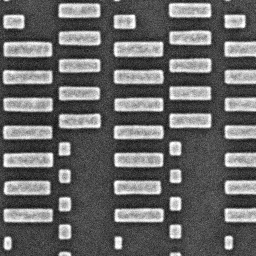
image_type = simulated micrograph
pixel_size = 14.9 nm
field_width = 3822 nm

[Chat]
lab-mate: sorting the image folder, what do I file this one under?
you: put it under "wiring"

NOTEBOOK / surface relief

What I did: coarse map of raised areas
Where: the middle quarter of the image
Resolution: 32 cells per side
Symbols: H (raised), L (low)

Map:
HHHHHHHHHLLLLLLLLLLLLLLLLLLHHHHH
HHHHHHHHHLLLLLLLLLLLLLLLLLLHHHHH
LLLLLLLLLLLLLHHHHHHHHHHHLLLLLLLL
LLLLLLLLLLLLLHHHHHHHHHHHHLLLLLLL
LLLLLLLLLLLLLHHHHHHHHHHHLLLLLLLL
LLLLLLLLLLLLLLLLLLLLLLLLLLLLLLLL
HHHHHHHHHLLLLLLLLLLLLLLLLLLHHHHH
HHHHHHHHHLLLLLLLLLLLLLLLLLLHHHHH
HHHHHHHHHLLLLLLLLLLLLLLLLLLHHHHH
LLLLLLLLLLLLLHHHHHHHHHHHLLLLLLLL
LLLLLLLLLLLLLHHHHHHHHHHHLLLLLLLL
LLLLLLLLLLLLLHHHHHHHHHHHLLLLLLLL
LLLLLLLLLLLLLLLLLLLLLLLLLLLLLLLL
HHHHHHHHHLLLLLLLLLLLLLLLLLLHHHHH
HHHHHHHHHLLLLLLLLLLLLLLLLLLHHHHH
HHHHHHHHHLLLLLLLLLLLLLLLLLLHHHHH
LLLLLLLLLLLLLHHHHHHHHHHHHLLLLLLL
LLLLLLLLLLLLLHHHHHHHHHHHHLLLLLLL
LLLLLLLLLLLLLLLLLLLLLLLLLLLLLLLL
LLLLLLLLLLLLLLLLLLLLLLLLLLLLLLLL
HLLLLLLLLLLLLLLLLLLLLLLLLLLHHLLL
HLLLLLLLLLLLLLLLLLLLLLLLLLLHHLLL
HLLLLLLLLLLLLHHHHHHHHHHHLLLHHLLL
LLLLLLLLLLLLLHHHHHHHHHHHLLLLLLLL
LLLLLLLLLLLLLHHHHHHHHHHHLLLLLLLL
LLLLLLLLLLLLLLLLLLLLLLLLLLLLLLLL
LLLLLLLLLLLLLLLLLLLLLLLLLLLLLLLL
HLLLLLLLLLLLLLLLLLLLLLLLLLLHHLLL
HLLLLLLLLLLLLLLLLLLLLLLLLLLHHLLL
LLLLLLLLLLLLLHHHHHHHHHHHLLLLLLLL
LLLLLLLLLLLLLHHHHHHHHHHHLLLLLLLL
LLLLLLLLLLLLLHHHHHHHHHHHLLLLLLLL